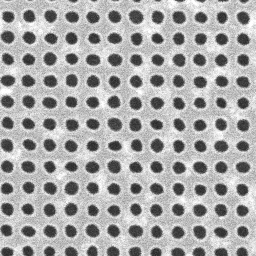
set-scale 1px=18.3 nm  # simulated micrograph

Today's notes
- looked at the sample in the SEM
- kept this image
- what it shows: a regular array of holes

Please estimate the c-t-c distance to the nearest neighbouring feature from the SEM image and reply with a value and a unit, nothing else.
0.381 microns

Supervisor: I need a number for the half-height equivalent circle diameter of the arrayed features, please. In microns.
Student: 0.244